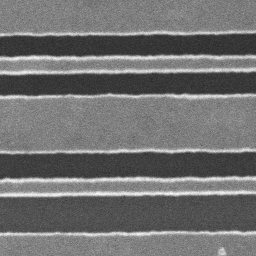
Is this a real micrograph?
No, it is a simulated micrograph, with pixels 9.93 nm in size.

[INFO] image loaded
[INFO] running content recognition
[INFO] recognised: lines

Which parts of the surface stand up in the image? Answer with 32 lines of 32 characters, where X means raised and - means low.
XXXXXXXXXXXXXXXXXXXXXXXXXXXXXXXX
XXXXXXXXXXXXXXXXXXXXXXXXXXXXXXXX
XXXXXXXXXXXXXXXXXXXXXXXXXXXXXXXX
XXXXXXXXXXXXXXXXXXXXXXXXXXXXXXXX
--------------------------------
--------------------------------
--------------------------------
XXXXXXXXXXXXXXXXXXXXXXXXXXXXXXXX
XXXXXXXXXXXXXXXXXXXXXXXXXXXXXXXX
--------------------------------
--------------------------------
--------------------------------
XXXXXXXXXXXXXXXXXXXXXXXXXXXXXXXX
XXXXXXXXXXXXXXXXXXXXXXXXXXXXXXXX
XXXXXXXXXXXXXXXXXXXXXXXXXXXXXXXX
XXXXXXXXXXXXXXXXXXXXXXXXXXXXXXXX
XXXXXXXXXXXXXXXXXXXXXXXXXXXXXXXX
XXXXXXXXXXXXXXXXXXXXXXXXXXXXXXXX
XXXXXXXXXXXXXXXXXXXXXXXXXXXXXXXX
--------------------------------
--------------------------------
--------------------------------
XXXXXXXXXXXXXXXXXXXXXXXXXXXXXXXX
XXXXXXXXXXXXXXXXXXXXXXXXXXXXXXXX
XXXXXXXX------------------------
--------------------------------
--------------------------------
--------------------------------
--------------------------------
XXXXXXXXXXXXXXXXXXXXXXXXXXXXXXXX
XXXXXXXXXXXXXXXXXXXXXXXXXXXXXXXX
XXXXXXXXXXXXXXXXXXXXXXXXXXXXXXXX